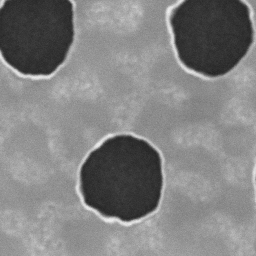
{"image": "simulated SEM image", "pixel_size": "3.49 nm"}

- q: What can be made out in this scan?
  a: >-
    holes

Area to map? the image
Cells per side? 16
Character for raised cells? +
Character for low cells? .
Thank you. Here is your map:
.....++++++....+
.....++++++.....
.....++++++.....
....+++++++....+
+..+++++++++..++
++++++++++++++++
++++++++++++++++
++++++++++++++++
+++++++.++++++++
++++++....++++++
+++++.....++++++
+++++.....++++++
+++++.....++++++
+++++++..+++++++
++++++++++++++++
++++++++++++++++